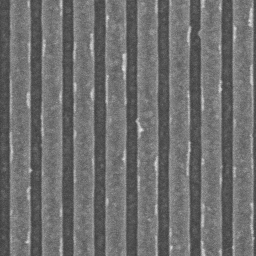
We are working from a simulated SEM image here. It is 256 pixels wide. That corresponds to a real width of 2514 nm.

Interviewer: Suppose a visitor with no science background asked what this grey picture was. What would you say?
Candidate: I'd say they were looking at parallel lines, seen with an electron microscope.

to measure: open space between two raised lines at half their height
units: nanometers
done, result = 122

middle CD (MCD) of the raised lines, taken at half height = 196 nm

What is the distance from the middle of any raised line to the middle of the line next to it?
312 nm